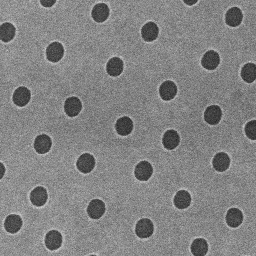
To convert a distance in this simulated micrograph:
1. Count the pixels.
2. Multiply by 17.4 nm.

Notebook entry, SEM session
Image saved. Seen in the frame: a regular array of holes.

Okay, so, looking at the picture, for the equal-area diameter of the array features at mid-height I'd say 354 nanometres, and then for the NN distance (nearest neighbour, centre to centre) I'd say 828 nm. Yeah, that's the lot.